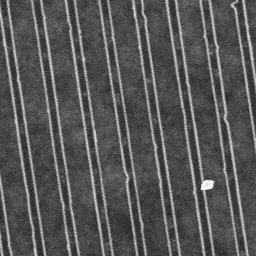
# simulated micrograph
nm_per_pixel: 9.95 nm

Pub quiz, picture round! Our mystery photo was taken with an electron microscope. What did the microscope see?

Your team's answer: parallel lines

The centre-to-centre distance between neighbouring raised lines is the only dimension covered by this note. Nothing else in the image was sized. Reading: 331 nanometers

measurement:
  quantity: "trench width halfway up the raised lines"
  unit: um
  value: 0.239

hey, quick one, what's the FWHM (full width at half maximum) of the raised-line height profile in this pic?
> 94.7 nm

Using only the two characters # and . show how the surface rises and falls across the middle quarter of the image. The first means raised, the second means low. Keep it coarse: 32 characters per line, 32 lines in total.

...##......##.......##......##..
...##......###......##......###.
...##......###......##......###.
...###......##......##.......##.
...###......##......##.......##.
....##......##......###......##.
....##......##......###......##.
....##......##.......##......##.
....##.......##......##......###
....###......##......##......###
....###......##......##.......##
.....##......##......###......##
.....##......##......###......##
.....##......###......##......##
.....##......###......##......##
.....##.......##......##......##
.....##.......##......##......##
.....###......##......##.......#
......##......##......###......#
......##......##......###......#
......##......##.......##......#
......##......###......##......#
......##.......##......##......#
......###......##......##......#
......###......##......##.......
.......##......##.......##......
#......##......##.......##......
#......##.......#.......##......
#......##.......##......##......
#......##.......##......##......
#......###......##......##......
#......###......##......##......